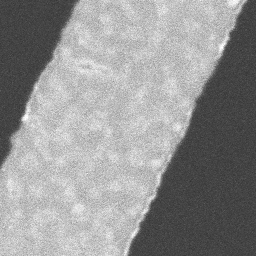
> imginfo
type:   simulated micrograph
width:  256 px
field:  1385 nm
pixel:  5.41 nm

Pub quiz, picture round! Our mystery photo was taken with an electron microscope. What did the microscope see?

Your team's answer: one or a few lines or trenches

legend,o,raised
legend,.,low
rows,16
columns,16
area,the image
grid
ooooo..........o
oooo..........oo
oooo..........oo
oooo..........oo
ooo..........ooo
oo...........ooo
oo..........oooo
oo..........oooo
o..........ooooo
o..........ooooo
..........oooooo
..........oooooo
.........ooooooo
.........ooooooo
........oooooooo
........oooooooo